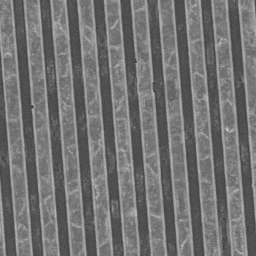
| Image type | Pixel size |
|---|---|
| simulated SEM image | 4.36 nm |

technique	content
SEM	parallel lines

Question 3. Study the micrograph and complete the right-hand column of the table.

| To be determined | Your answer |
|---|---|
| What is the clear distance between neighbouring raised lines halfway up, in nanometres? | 54.3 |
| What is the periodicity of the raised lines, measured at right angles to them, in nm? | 116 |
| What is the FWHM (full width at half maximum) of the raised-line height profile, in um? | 0.0624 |